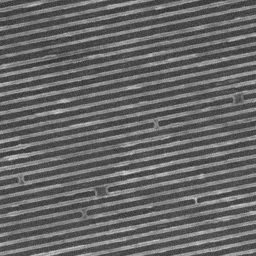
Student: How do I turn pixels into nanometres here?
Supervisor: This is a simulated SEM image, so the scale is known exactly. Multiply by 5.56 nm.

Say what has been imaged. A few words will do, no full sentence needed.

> parallel lines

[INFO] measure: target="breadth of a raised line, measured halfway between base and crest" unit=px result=3.31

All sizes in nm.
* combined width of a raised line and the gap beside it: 51.1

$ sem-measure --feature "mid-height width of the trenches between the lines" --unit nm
32.7